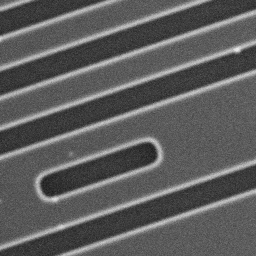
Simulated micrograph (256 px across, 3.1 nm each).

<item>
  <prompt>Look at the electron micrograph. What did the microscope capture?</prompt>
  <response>groups of lines, slits or small figures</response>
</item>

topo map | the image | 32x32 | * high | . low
**...........************.......
.........*************..........
.......***********...........***
....************..........******
************...........*********
*********...........************
*******..........************...
****..........************......
*..........************.........
........************..........**
.....************..........*****
..************..........********
***********..........***********
********..........**************
*****..........*****************
**..........********************
.........***********************
......**************************
...************.....************
************........************
*********..........************.
******..........************....
*****.........************......
*****......************.........
*****...************..........**
*****************..........*****
**************..........********
***********..........***********
********..........**************
*****..........*****************
**..........********************
.........***********************